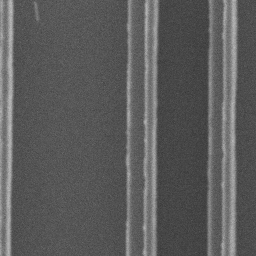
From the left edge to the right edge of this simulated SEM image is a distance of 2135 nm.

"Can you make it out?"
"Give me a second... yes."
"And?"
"lines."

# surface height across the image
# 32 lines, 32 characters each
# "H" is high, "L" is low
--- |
HLLLLLLLLLLLLLLLHHHLLLLLLLHHHLLL
HLLLLLLLLLLLLLLLHHHLLLLLLLHHHLLL
HLLLLLLLLLLLLLLLHHHLLLLLLLHHHLLL
HLLLLLLLLLLLLLLLHHHLLLLLLLHHHLLL
HLLLLLLLLLLLLLLLHHHLLLLLLLHHHLLL
HLLLLLLLLLLLLLLLHHHLLLLLLLHHHLLL
HLLLLLLLLLLLLLLLHHHLLLLLLLHHHLLL
HLLLLLLLLLLLLLLLHHHLLLLLLLHHHLLL
HLLLLLLLLLLLLLLLHHHLLLLLLLHHHLLL
HLLLLLLLLLLLLLLLHHHLLLLLLLHHHLLL
HLLLLLLLLLLLLLLLHHHLLLLLLLHHHLLL
HLLLLLLLLLLLLLLLHHHLLLLLLLHHHLLL
HLLLLLLLLLLLLLLLHHHLLLLLLLHHHLLL
HLLLLLLLLLLLLLLLHHHLLLLLLLHHHLLL
HLLLLLLLLLLLLLLLHHHLLLLLLLHHHLLL
HLLLLLLLLLLLLLLLHHHLLLLLLLHHHLLL
HLLLLLLLLLLLLLLLHHHLLLLLLLHHHLLL
HLLLLLLLLLLLLLLLHHHLLLLLLLHHHLLL
HLLLLLLLLLLLLLLLHHHLLLLLLLHHHLLL
HLLLLLLLLLLLLLLLHHHLLLLLLLHHHLLL
HLLLLLLLLLLLLLLLHHHLLLLLLLHHHLLL
HLLLLLLLLLLLLLLLHHHLLLLLLLHHHLLL
HLLLLLLLLLLLLLLLHHHLLLLLLLHHHLLL
HLLLLLLLLLLLLLLLHHHLLLLLLLHHHLLL
HLLLLLLLLLLLLLLLHHHLLLLLLLHHHLLL
HLLLLLLLLLLLLLLLHHHLLLLLLLHHHLLL
HLLLLLLLLLLLLLLLHHHLLLLLLLHHHLLL
HLLLLLLLLLLLLLLLHHHLLLLLLLHHHLLL
HLLLLLLLLLLLLLLLHHHLLLLLLLHHHLLL
HLLLLLLLLLLLLLLLHHHLLLLLLLHHHLLL
HLLLLLLLLLLLLLLLHHHLLLLLLLHHHLLL
HLLLLLLLLLLLLLLLHHHLLLLLLLHHHLLL